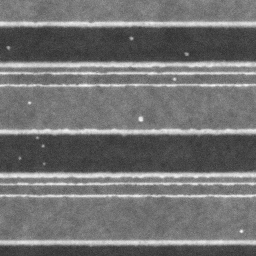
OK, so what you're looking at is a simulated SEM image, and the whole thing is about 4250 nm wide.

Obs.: lines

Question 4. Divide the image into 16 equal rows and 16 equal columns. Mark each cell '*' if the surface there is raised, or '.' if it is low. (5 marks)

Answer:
****************
................
................
................
****************
****************
****************
****************
................
................
................
****************
****************
****************
****************
................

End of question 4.